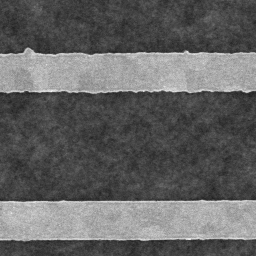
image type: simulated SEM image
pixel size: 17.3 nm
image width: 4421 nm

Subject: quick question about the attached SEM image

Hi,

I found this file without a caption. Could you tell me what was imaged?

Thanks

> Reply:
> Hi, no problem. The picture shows one or a few lines or trenches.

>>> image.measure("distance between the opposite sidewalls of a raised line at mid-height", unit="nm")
648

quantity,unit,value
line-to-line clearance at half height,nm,1900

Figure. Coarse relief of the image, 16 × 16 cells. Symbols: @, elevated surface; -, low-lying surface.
----------------
----------------
----------------
@@@@@@@@@@@@@@@@
@@@@@@@@@@@@@@@@
@@@@@@@@@@@@@@@@
----------------
----------------
----------------
----------------
----------------
----------------
----------------
@@@@@@@@@@@@@@@@
@@@@@@@@@@@@@@@@
----------------